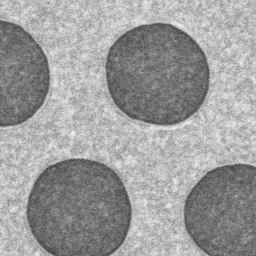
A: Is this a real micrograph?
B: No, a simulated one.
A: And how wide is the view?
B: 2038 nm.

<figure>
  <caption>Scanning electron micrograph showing holes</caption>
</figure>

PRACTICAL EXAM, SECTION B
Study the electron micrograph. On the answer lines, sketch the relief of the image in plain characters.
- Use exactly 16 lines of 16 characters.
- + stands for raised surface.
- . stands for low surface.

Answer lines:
++++++++++++++++
.++++++++.++++++
..+++++.....++++
...++++......+++
...++++......+++
...++++......+++
...++++......+++
..+++++++...++++
++++++++++++++++
++++++++++++++++
+++....+++++++..
++......++++....
++......++++....
++......+++.....
++......++++....
+++....+++++....